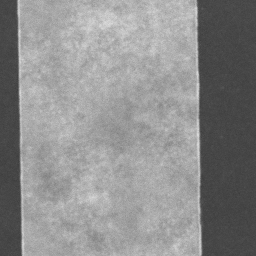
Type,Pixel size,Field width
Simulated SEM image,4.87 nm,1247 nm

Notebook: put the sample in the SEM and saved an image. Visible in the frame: one or a few lines or trenches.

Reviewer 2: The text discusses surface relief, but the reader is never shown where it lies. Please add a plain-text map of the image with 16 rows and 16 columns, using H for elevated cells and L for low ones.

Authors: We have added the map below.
LHHHHHHHHHHHLLLL
LHHHHHHHHHHHLLLL
LHHHHHHHHHHHLLLL
LHHHHHHHHHHHLLLL
LHHHHHHHHHHHLLLL
LHHHHHHHHHHHLLLL
LHHHHHHHHHHHLLLL
LHHHHHHHHHHHLLLL
LHHHHHHHHHHHLLLL
LHHHHHHHHHHHLLLL
LHHHHHHHHHHHLLLL
LHHHHHHHHHHHLLLL
LHHHHHHHHHHHLLLL
LHHHHHHHHHHHLLLL
LHHHHHHHHHHHHLLL
LHHHHHHHHHHHHLLL